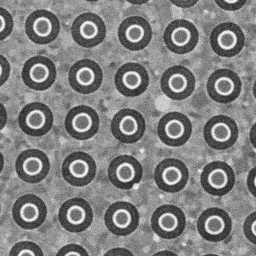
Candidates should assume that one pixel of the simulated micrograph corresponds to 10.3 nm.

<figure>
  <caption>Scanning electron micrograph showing an array of small figures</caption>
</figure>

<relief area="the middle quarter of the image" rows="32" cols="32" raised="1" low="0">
11000000011111000000111111100011
10001110001110000000111110000001
10011110001110001100011110000000
10011110001100011110011100011100
10001110001100011110011100111100
11000000011110001100011100011100
11000000111110000000011100001000
11110011111111000000111110000000
11111111111111111111111111000001
11111111111111111111111111111111
11100011111111111111111111111111
10000000111111000011111111111111
10000000111110000001111110000011
00011100011100011000111100000001
00111110011100111100111100011000
00011110011100111100011000111000
00011100111100111100111000111100
10000000111100000000111000111000
11000001111110000001111100000000
11111111111111000011111110000001
11111111111111111111111111000111
11111111111111111111111111111111
11000011111111111111111111111111
00000001111110000011111111001111
00011000111100000001111100000011
00111100111000110001111000000001
00111100111000111000111000110001
00111000111001111000110001111001
00000000111000111001110001111001
10000001111100000001111000110001
11100111111110000111111000000001
11111111111111101111111100000111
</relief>